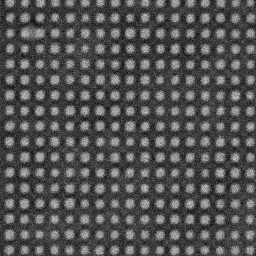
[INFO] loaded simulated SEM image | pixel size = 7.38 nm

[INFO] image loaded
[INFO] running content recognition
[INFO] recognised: a regular array of raised bodies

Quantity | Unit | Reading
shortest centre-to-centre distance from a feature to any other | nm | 109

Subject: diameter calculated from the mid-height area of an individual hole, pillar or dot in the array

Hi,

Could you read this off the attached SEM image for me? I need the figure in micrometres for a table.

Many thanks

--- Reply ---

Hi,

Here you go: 0.065